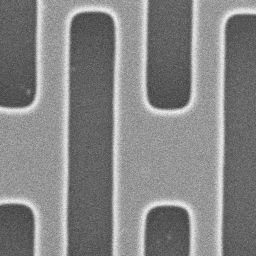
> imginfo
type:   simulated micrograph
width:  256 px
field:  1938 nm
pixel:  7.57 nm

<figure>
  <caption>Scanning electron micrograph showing groups of lines, slits or small figures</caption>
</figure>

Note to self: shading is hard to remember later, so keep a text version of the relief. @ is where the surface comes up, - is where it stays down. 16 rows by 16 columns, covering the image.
--@@@@@@@---@@@@
--@@---@@---@@--
--@@---@@---@@--
--@@---@@---@@--
--@@---@@---@@--
--@@---@@---@@--
--@@---@@---@@--
@@@@---@@@@@@@--
@@@@---@@@@@@@--
@@@@---@@@@@@@--
@@@@---@@@@@@@--
@@@@---@@@@@@@--
@@@@---@@@@@@@--
--@@---@@---@@--
--@@---@@---@@--
--@@---@@---@@--